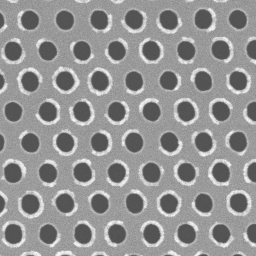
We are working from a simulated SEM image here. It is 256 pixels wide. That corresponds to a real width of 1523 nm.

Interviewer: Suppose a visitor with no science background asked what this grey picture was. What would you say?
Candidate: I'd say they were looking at a regular array of holes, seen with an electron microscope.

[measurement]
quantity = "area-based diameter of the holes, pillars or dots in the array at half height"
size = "111 nanometres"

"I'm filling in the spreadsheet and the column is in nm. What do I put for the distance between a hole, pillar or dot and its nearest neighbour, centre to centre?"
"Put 205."